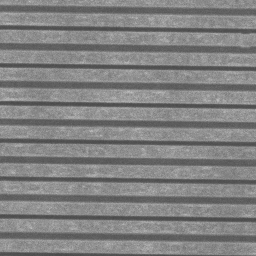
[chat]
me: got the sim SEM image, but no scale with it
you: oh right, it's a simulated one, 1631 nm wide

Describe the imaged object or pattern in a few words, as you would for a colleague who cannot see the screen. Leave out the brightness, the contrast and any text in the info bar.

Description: parallel lines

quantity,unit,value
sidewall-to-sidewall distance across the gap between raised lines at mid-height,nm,42.2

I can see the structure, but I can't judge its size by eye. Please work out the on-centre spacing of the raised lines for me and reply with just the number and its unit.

120 nm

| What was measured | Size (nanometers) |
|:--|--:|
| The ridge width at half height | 90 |